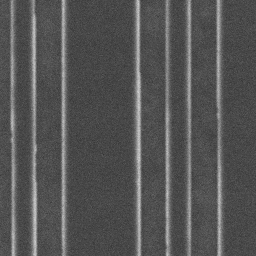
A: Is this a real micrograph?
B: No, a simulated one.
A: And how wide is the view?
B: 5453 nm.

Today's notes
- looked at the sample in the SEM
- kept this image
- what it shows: lines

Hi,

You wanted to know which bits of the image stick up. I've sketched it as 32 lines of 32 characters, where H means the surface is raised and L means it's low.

LHHHLLLLHHHHHHHHHLLLLHHHLLLHHHHH
LHHHLLLLHHHHHHHHHLLLLHHHLLLHHHHH
LHHHLLLLHHHHHHHHHLLLLHHHLLLHHHHH
LHHHLLLLHHHHHHHHHLLLLHHHLLLHHHHH
LHHHLLLLHHHHHHHHHLLLLHHHLLLHHHHH
LHHHLLLLHHHHHHHHHLLLLHHHLLLHHHHH
LHHHLLLLHHHHHHHHHLLLLHHHLLLHHHHH
LHHHLLLLHHHHHHHHHLLLLHHHLLLHHHHH
LHHHLLLLHHHHHHHHHLLLLHHHLLLHHHHH
LHHHLLLLHHHHHHHHHLLLLHHHLLLHHHHH
LHHHLLLLHHHHHHHHHLLLLHHHLLLHHHHH
LHHHLLLLHHHHHHHHHLLLLHHHLLLHHHHH
LHHHLLLLHHHHHHHHHLLLLHHHLLLHHHHH
LHHHLLLLHHHHHHHHHLLLLHHHLLLHHHHH
LHHHLLLLHHHHHHHHHLLLLHHHLLLHHHHH
LHHHLLLLHHHHHHHHHLLLLHHHLLLHHHHH
LHHHLLLLHHHHHHHHHLLLLHHHLLLHHHHH
LLHHLLLLHHHHHHHHHLLLLHHHLLLHHHHH
LLHHLLLLHHHHHHHHHLLLLHHHLLLHHHHH
LLHHLLLLHHHHHHHHHLLLLHHHLLLHHHHH
LLHHLLLLHHHHHHHHHLLLLHHHLLLHHHHH
LLHHLLLLHHHHHHHHHLLLLHHHLLLHHHHH
LLHHLLLLHHHHHHHHHLLLLHHHLLLHHHHH
LLHHLLLLHHHHHHHHHLLLLHHHLLLHHHHH
LLHHLLLLHHHHHHHHHLLLLHHHLLLHHHHH
LLHHLLLLHHHHHHHHHLLLLHHHLLLHHHHH
LLHHLLLLHHHHHHHHHLLLLHHHLLLHHHHH
LLHHLLLLHHHHHHHHHLLLLHHHLLLHHHHH
LLHHLLLLHHHHHHHHHLLLLHHHLLLHHHHH
LLHHLLLLHHHHHHHHHLLLLHHHLLLHHHHH
LLHHLLLLHHHHHHHHHLLLLHHHLLLHHHHH
LLHHLLLLHHHHHHHHHLLLLHHHLLLHHHHH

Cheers